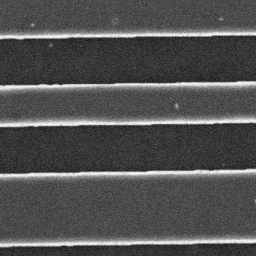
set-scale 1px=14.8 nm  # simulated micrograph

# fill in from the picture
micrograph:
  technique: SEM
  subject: lines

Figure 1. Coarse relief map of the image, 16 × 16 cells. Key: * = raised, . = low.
****************
****************
................
................
................
****************
****************
****************
................
................
................
****************
****************
****************
****************
................